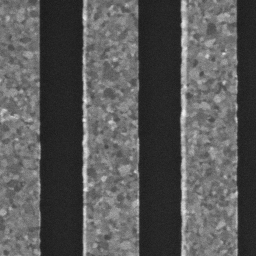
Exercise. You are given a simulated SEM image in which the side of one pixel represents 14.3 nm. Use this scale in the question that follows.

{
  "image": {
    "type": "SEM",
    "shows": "lines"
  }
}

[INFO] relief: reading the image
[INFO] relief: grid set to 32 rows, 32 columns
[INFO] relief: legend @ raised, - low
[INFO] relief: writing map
@@@@@------@@@@@@------@@@@@@---
@@@@@------@@@@@@------@@@@@@---
@@@@@------@@@@@@------@@@@@@---
@@@@@------@@@@@@------@@@@@@---
@@@@@------@@@@@@------@@@@@@@--
@@@@@-----@@@@@@@------@@@@@@---
@@@@@-----@@@@@@@------@@@@@@---
@@@@@-----@@@@@@@------@@@@@@@--
@@@@@-----@@@@@@@------@@@@@@---
@@@@@-----@@@@@@@------@@@@@@@--
@@@@@------@@@@@@------@@@@@@@--
@@@@@------@@@@@@------@@@@@@@--
@@@@@------@@@@@@------@@@@@@---
@@@@@------@@@@@@------@@@@@@@--
@@@@@------@@@@@@------@@@@@@---
@@@@@------@@@@@@------@@@@@@@--
@@@@@------@@@@@@------@@@@@@@--
@@@@@------@@@@@@------@@@@@@@--
@@@@@------@@@@@@------@@@@@@@--
@@@@@------@@@@@@------@@@@@@@--
@@@@@------@@@@@@------@@@@@@@--
@@@@@------@@@@@@------@@@@@@---
@@@@@------@@@@@@------@@@@@@---
@@@@@------@@@@@@------@@@@@@@--
@@@@@------@@@@@@------@@@@@@@--
@@@@@------@@@@@@------@@@@@@@--
@@@@@------@@@@@@------@@@@@@@--
@@@@@-----@@@@@@@------@@@@@@@--
@@@@@-----@@@@@@@------@@@@@@@--
@@@@@------@@@@@@------@@@@@@@--
@@@@@------@@@@@@------@@@@@@@--
@@@@@------@@@@@@------@@@@@@@--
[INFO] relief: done